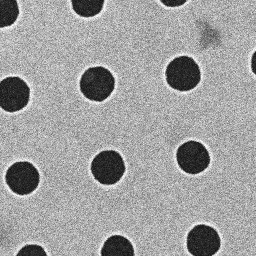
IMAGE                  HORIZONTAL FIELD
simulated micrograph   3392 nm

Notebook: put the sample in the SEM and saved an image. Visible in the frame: holes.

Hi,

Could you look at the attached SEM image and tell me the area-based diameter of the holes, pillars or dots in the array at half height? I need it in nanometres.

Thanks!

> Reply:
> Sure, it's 461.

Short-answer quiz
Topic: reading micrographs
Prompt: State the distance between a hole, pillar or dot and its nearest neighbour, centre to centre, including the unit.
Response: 1120 nanometers